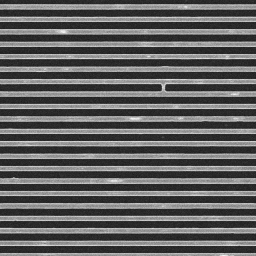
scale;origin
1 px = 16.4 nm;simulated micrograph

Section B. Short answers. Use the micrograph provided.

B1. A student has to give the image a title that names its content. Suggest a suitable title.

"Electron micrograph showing parallel lines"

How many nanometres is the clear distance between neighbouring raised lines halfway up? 121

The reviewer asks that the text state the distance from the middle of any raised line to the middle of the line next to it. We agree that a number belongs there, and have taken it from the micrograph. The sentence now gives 204 nm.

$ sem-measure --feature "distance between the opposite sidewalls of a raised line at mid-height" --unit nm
76